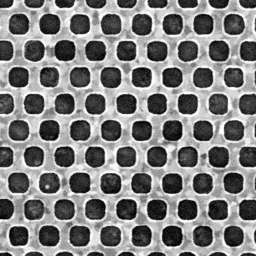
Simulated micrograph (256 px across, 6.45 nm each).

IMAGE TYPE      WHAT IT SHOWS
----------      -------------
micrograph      a regular array of holes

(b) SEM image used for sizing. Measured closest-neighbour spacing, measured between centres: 196 nm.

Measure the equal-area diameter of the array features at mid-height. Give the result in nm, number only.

148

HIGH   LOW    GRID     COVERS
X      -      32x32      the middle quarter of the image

XXX--XXXXXX-XXXXXXX-XXXXXXXXXXXX
XX----XXX-----XXX-----XXX----XXX
X------XX-----XXX-----XX------XX
X------XX------XX-----XX------XX
X------XX-----XXX-----XX------XX
XX----XXXX----XXX-----XXX----XXX
XXXXXXXXXXXXXXXXXXXXXXXXXXXXXXXX
--XXXX----XXXX---XXXXX---XXXX---
---XX-----XXX-----XXX-----XX----
---XX------XX-----XXX-----XX----
---XX------XX-----XXX-----XX----
---XX-----XXX-----XXX-----XX----
--XXXX----XXXX---XXXXX---XXXX---
XXXXXXXXXXXXXXXXXXXXXXXXXXXXXXXX
XX----XXXX----XXX----XXXX----XXX
X------XX-----XXX-----XXX-----XX
X------XX------XX-----XX------XX
X------XX-----XXX-----XX------XX
XX----XXX-----XXX-----XXX-----XX
XXX-XXXXXXXXXXXXXXXXXXXXXXXXXXXX
-XXXXXX--XXXXX---XXXXX--XXXXXX--
---XX-----XXX-----XXX-----XX----
---XX------XX-----XX------XX----
---XX------XX-----XX------XX----
---XX-----XXX-----XXX-----XX----
--XXXX----XXXX----XXX----XXXX---
XXXXXXXXXXXXXXXXXXXXXXXXXXXXXXXX
XX----XXXX----XXX----XXXX----XXX
X------XX-----XXX-----XXX-----XX
X------XX------XX-----XX------XX
X------XX------XX-----XX------XX
XX-----XX-----XXX-----XXX-----XX